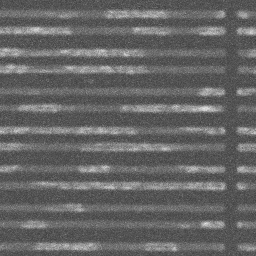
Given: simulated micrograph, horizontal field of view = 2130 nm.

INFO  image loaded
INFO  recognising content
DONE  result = parallel lines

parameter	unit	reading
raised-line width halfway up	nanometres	40.6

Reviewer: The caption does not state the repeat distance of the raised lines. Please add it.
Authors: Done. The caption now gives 0.161 um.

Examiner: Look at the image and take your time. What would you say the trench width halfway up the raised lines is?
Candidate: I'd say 119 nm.